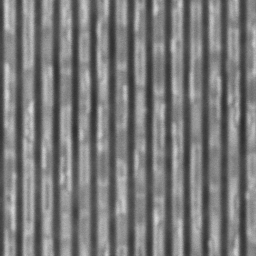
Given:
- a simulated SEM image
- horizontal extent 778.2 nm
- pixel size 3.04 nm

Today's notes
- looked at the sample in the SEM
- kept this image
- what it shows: parallel lines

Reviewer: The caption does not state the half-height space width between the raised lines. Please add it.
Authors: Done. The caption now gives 23.9 nanometres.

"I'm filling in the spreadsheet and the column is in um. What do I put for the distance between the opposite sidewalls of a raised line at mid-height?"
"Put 0.0327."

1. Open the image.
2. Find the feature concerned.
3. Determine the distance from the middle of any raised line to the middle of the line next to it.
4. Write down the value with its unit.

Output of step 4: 56.5 nm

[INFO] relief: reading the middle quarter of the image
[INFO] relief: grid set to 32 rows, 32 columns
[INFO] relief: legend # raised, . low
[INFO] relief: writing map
##..##..###..###..##...##..##...
##..##..###..###..##...##..##...
##..##..###..###..##...##..##...
##..##..###..###..##...##..##...
##..##..###..###..##...##..##...
##..##..###..###..##...##..##...
##..##..###..###..##...##..##...
##..##..###..###..##...##..##...
##..##..###..###..##...##..##...
##..##..###..###..##...##..##...
##..##..###..###..##...##..##...
##..##..###..###..##...##..##...
##..##..###..###..##...##..##...
##..##...##..###..##...##..##...
##..##...##..###..##...##..##...
##..##..###..###..##...##..##...
##..##..###..###..##...##..##...
.#..##..###..###..##...##..##...
##..##..###..###..##...##..##...
##..##..###..###..##...##..##...
##..##..###..###..##...##..##...
##..##..###..###..##...##..##...
##..##..###..###..##...##..##...
##..##..###..###..##...##..##...
##..##..###..###..##...##..##...
##..##..###..###..##...##..##...
##..##..###..###..##...##..##...
##..##..###..###..##...##..##...
##..##..###..###..##...##..##...
##..##..###..###..##...##..##...
##..##..###..###..##...##..##...
##..##..###..###..##...##..##...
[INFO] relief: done